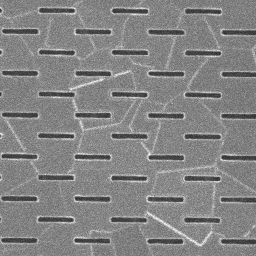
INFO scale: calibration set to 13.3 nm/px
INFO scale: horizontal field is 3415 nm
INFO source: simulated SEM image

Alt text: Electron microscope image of a regular array of holes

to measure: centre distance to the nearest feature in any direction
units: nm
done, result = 550